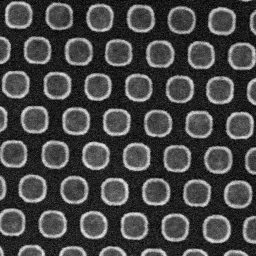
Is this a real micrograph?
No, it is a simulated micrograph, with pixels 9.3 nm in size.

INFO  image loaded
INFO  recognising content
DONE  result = a regular array of raised bodies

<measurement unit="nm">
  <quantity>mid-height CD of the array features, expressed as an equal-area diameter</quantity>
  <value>243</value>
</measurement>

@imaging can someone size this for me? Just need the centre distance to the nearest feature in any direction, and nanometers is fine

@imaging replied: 371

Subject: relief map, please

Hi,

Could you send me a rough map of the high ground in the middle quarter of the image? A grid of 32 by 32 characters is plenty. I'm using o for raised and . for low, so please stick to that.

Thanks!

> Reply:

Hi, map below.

........................oo......
................................
................................
o.....ooooo.....ooooo......oooo.
o.....ooooo.....oooooo....oooooo
o.....ooooo.....oooooo....oooooo
o....oooooo.....oooooo....oooooo
o.....ooooo.....oooooo....oooooo
.......ooo.......oooo......oooo.
................................
................................
.oooo...........................
oooooo.....ooooo.....ooooo......
oooooo....oooooo.....ooooo.....o
oooooo....oooooo....ooooooo....o
oooooo....oooooo.....oooooo....o
ooooo......ooooo.....ooooo.....o
............ooo......ooooo.....o
................................
................................
......oooo......oooo............
o....oooooo....oooooo.....ooooo.
o....oooooo....oooooo....oooooo.
o....oooooo....oooooo....oooooo.
.....oooooo....oooooo....oooooo.
......oooo......ooooo.....ooooo.
..........................oooo..
................................
................................
ooooo.....ooooo......oooo......o
oooooo....ooooo.....oooooo.....o
oooooo....oooooo....oooooo....oo